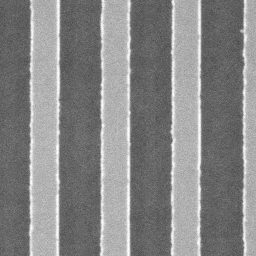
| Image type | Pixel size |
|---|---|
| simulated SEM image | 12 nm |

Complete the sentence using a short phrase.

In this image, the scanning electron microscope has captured lines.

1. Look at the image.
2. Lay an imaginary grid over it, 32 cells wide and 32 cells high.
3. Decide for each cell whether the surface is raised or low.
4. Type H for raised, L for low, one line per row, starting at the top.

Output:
LLLLHHHLLLLLLHHHLLLLLLHHHLLLLLLH
LLLLHHHLLLLLLHHHLLLLLLHHHLLLLLLH
LLLLHHHLLLLLLHHHLLLLLLHHHLLLLLLH
LLLLHHHLLLLLLHHHLLLLLLHHHLLLLLLH
LLLLHHHLLLLLLHHHLLLLLLHHHLLLLLLH
LLLLHHHLLLLLLHHHLLLLLLHHHLLLLLLH
LLLLHHHLLLLLLHHHLLLLLHHHHLLLLLHH
LLLLHHHLLLLLLHHHLLLLLLHHHLLLLLLH
LLLLHHHLLLLLLHHHLLLLLLHHHLLLLLLH
LLLLHHHLLLLLLHHHLLLLLLHHHLLLLLHH
LLLLHHHLLLLLLHHHLLLLLLHHHLLLLLLH
LLLLHHHLLLLLLHHHLLLLLLHHHLLLLLHH
LLLLHHHLLLLLLHHHLLLLLLHHHLLLLLHH
LLLLHHHLLLLLLHHHLLLLLLHHHLLLLLHH
LLLLHHHLLLLLLHHHLLLLLLHHHLLLLLHH
LLLLHHHLLLLLLHHHLLLLLLHHHLLLLLHH
LLLLHHHLLLLLLHHHLLLLLHHHHLLLLLHH
LLLLHHHLLLLLLHHHLLLLLLHHHLLLLLHH
LLLLHHHLLLLLLHHHLLLLLLHHHLLLLLHH
LLLLHHHLLLLLLHHHLLLLLLHHHLLLLLHH
LLLLHHHLLLLLLHHHLLLLLLHHHLLLLLLH
LLLLHHHLLLLLLHHHLLLLLHHHHLLLLLLH
LLLLHHHLLLLLLHHHLLLLLHHHHLLLLLLH
LLLLHHHLLLLLLHHHLLLLLLHHHLLLLLHH
LLLLHHHLLLLLLHHHLLLLLHHHHLLLLLHH
LLLLHHHLLLLLLHHHLLLLLHHHHLLLLLHH
LLLLHHHLLLLLLHHHLLLLLLHHHLLLLLHH
LLLLHHHLLLLLLHHHLLLLLLHHHLLLLLHH
LLLLHHHLLLLLLHHHLLLLLHHHHLLLLLHH
LLLLHHHLLLLLLHHHLLLLLHHHHLLLLLHH
LLLLHHHLLLLLLHHHLLLLLHHHHLLLLLLH
LLLLHHHLLLLLLHHHLLLLLHHHHLLLLLLH